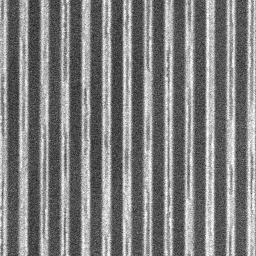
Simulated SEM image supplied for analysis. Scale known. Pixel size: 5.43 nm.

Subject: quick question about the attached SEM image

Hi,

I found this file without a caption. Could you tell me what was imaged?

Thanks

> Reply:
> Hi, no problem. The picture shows parallel lines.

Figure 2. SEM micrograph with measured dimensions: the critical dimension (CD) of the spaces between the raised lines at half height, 67.9 nanometers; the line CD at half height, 44.1 nm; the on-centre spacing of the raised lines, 112 nm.